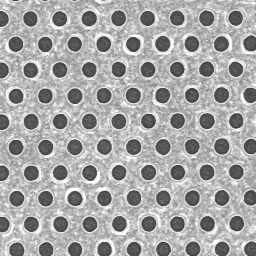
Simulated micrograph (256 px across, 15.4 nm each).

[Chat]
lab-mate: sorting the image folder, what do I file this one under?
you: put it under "a regular array of holes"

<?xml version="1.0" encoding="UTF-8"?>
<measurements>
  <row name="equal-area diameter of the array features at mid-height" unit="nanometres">241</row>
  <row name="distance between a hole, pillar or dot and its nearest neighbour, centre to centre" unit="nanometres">449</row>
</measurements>